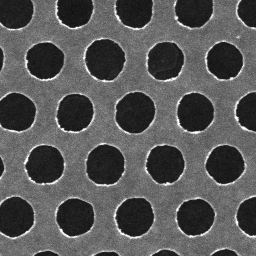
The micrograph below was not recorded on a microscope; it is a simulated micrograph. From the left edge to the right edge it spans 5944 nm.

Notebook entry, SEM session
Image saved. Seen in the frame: a regular array of holes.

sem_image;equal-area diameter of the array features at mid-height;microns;0.891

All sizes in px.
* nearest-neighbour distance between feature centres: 59.8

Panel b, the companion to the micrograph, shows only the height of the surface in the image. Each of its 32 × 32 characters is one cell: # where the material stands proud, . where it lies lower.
....###.....##.....###.....###..
....###.....##.....###.....###..
....####...####....###....####..
#..##############.######.#######
################################
#####..####....#####..#####..###
###.....###....####....###....##
###.....###.....###....###....##
###.....###....####....###....##
####...#####...####...#####..###
################################
################################
....####...####....####...####..
....###.....###....###.....###..
....###.....##.....###.....###..
....###....####....###....####..
################..##############
################################
####...#####...####...#####...##
####....###....####....###....##
###.....###.....##.....###.....#
###.....###....####....###....##
####...####....####...#####...##
################################
################################
....####...####....####...####..
....###.....###....###.....###..
....###.....##.....###.....###..
....####...####....###....####..
#.#######.######.###############
################################
#####..#############..#####..###